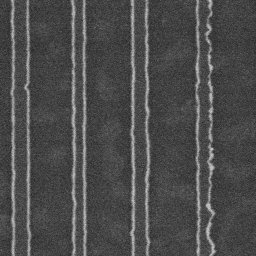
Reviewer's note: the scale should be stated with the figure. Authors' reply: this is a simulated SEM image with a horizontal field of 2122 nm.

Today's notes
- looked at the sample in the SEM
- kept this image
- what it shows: one or a few lines or trenches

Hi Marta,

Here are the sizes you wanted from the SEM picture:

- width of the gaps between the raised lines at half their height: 0.402 micrometres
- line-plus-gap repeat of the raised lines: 0.507 µm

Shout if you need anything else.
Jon